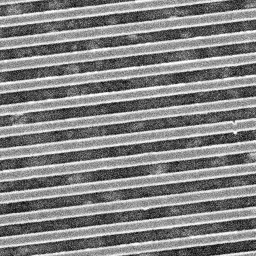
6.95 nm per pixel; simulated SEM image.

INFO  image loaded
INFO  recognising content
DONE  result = parallel lines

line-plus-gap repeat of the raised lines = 152 nm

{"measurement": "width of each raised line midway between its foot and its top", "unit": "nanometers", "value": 66.4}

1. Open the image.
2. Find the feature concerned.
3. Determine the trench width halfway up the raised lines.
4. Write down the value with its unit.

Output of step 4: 83.7 nanometres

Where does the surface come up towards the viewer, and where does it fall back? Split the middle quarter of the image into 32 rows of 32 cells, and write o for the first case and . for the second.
......................oooooooooo
.............ooooooooooooooooooo
.....ooooooooooooooooooo........
ooooooooooooooo.................
ooooooo.........................
..........................oooooo
..................oooooooooooooo
..........oooooooooooooooooo....
.ooooooooooooooooooo............
oooooooooooo....................
ooo...........................oo
.....................ooooooooooo
.............ooooooooooooooooooo
.....oooooooooooooooooo.........
ooooooooooooooo.................
ooooooo.........................
.........................ooooooo
.................ooooooooooooooo
........oooooooooooooooooooo....
oooooooooooooooooooo............
ooooooooooo.....................
ooo...........................oo
....................oooooooooooo
.............ooooooooooooooooooo
.....oooooooooooooooooooo.......
oooooooooooooooo................
oooooooo........................
..........................oooooo
..................oooooooooooooo
.........ooooooooooooooooooo....
.ooooooooooooooooooo............
ooooooooooo.....................